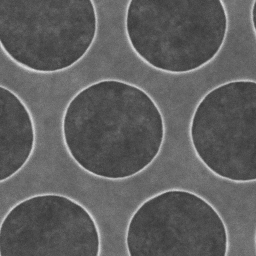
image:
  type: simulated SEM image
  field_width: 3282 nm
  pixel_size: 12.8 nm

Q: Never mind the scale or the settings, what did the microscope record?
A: holes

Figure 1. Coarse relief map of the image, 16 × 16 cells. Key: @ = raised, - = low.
------@@------@@
------@@------@@
------@@------@@
@----@@@@----@@@
@@@@@@@@@@@@@@@@
@@@@@@---@@@@@--
-@@@------@@@---
--@@------@@----
--@@------@@----
--@@------@@----
-@@@@----@@@@---
@@@@@@@@@@@@@@@@
@@--@@@@@----@@@
------@@------@@
------@@------@@
------@@------@@